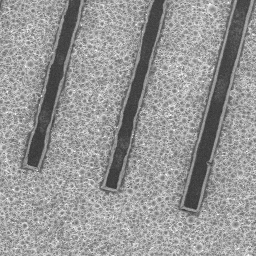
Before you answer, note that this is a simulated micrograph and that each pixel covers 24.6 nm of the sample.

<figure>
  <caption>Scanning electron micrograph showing one or a few lines or trenches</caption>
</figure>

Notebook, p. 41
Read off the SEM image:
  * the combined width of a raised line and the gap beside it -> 81.6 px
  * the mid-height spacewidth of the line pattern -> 66.3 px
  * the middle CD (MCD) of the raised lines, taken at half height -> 385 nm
